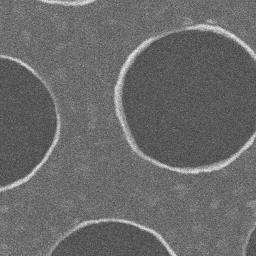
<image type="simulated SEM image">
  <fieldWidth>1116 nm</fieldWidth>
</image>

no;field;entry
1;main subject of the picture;holes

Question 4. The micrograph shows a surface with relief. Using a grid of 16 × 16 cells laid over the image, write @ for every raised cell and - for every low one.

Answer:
@@@@@@@@@@@@@@@@
@@@@@@@@@@@@@@@@
@@@@@@@@@@-----@
@@@@@@@@--------
--@@@@@@--------
---@@@@@--------
---@@@@@--------
----@@@@--------
---@@@@@--------
---@@@@@@------@
--@@@@@@@@@--@@@
-@@@@@@@@@@@@@@@
@@@@@@@@@@@@@@@@
@@@@@@@@@@@@@@@@
@@@@@----@@@@@@@
@@@-------@@@@@-